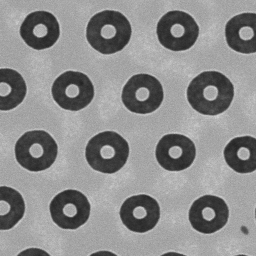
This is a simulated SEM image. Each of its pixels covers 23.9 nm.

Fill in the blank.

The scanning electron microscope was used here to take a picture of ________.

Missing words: a regular array of ring-shaped grooves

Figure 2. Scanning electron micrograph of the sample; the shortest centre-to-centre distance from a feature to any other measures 1.63 micrometres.